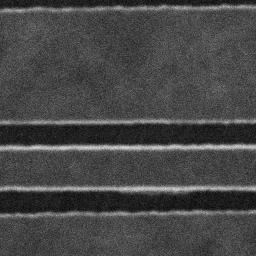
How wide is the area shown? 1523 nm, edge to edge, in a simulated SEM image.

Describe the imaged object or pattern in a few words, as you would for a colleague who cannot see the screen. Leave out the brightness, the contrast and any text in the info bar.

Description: lines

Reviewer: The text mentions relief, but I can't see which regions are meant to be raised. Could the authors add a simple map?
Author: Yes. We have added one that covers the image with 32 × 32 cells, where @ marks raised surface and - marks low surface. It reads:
--------------------------------
@@@@@@@@@@@@@@@@@@@@@@@@@@@@@@@@
@@@@@@@@@@@@@@@@@@@@@@@@@@@@@@@@
@@@@@@@@@@@@@@@@@@@@@@@@@@@@@@@@
@@@@@@@@@@@@@@@@@@@@@@@@@@@@@@@@
@@@@@@@@@@@@@@@@@@@@@@@@@@@@@@@@
@@@@@@@@@@@@@@@@@@@@@@@@@@@@@@@@
@@@@@@@@@@@@@@@@@@@@@@@@@@@@@@@@
@@@@@@@@@@@@@@@@@@@@@@@@@@@@@@@@
@@@@@@@@@@@@@@@@@@@@@@@@@@@@@@@@
@@@@@@@@@@@@@@@@@@@@@@@@@@@@@@@@
@@@@@@@@@@@@@@@@@@@@@@@@@@@@@@@@
@@@@@@@@@@@@@@@@@@@@@@@@@@@@@@@@
@@@@@@@@@@@@@@@@@@@@@@@@@@@@@@@@
@@@@@@@@@@@@@@@@@@@@@@@@@@@@@@@@
--------------------------------
--------------------------------
--------------------------------
@@--@@@@@@@@@@@@@@@@@@@@@@@@@@@@
@@@@@@@@@@@@@@@@@@@@@@@@@@@@@@@@
@@@@@@@@@@@@@@@@@@@@@@@@@@@@@@@@
@@@@@@@@@@@@@@@@@@@@@@@@@@@@@@@@
@@@@@@@@@@@@@@@@@@@@@@@@@@@@@@@@
@@@@@@@@@@@@@@@@@@@@@@@@@@@@@@@@
--------------------------------
--------------------------------
------------------------@@--@-@@
@@@@@@@@@@@@@@@@@@@@@@@@@@@@@@@@
@@@@@@@@@@@@@@@@@@@@@@@@@@@@@@@@
@@@@@@@@@@@@@@@@@@@@@@@@@@@@@@@@
@@@@@@@@@@@@@@@@@@@@@@@@@@@@@@@@
@@@@@@@@@@@@@@@@@@@@@@@@@@@@@@@@